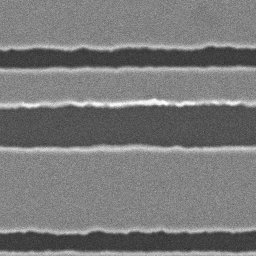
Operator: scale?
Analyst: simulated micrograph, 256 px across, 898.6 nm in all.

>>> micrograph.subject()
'lines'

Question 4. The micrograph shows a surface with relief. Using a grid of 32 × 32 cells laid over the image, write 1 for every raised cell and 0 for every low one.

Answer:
11111111111111111111111111111111
11111111111111111111111111111111
11111111111111111111111111111111
11111111111111111111111111111111
11111111111111111111111111111111
11111111111111111111111111111111
00000000000000000000000000000000
00000000000000000000000000000000
00000001001100011111111111111111
11111111111111111111111111111111
11111111111111111111111111111111
11111111111111111111111111111111
11111111111111111111111111111111
00000000000000000000000000000000
00000000000000000000000000000000
00000000000000000000000000000000
00000000000000000000000000000000
00000000000000000000000000000000
00000000000011011111011000000110
11111111111111111111111111111111
11111111111111111111111111111111
11111111111111111111111111111111
11111111111111111111111111111111
11111111111111111111111111111111
11111111111111111111111111111111
11111111111111111111111111111111
11111111111111111111111111111111
11111111111111111111111111111111
11111111111111111111111111111111
00000000000000000000000000000000
00000000000000000000000000000000
10011111110011000000001011100001